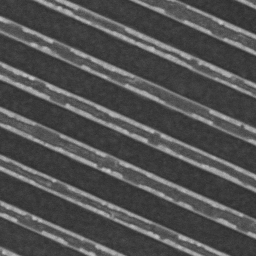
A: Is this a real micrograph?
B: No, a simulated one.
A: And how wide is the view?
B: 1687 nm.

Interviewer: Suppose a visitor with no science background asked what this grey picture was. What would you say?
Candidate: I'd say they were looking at parallel lines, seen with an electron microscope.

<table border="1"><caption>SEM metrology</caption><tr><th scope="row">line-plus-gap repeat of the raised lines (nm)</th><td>278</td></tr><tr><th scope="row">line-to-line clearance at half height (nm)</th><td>179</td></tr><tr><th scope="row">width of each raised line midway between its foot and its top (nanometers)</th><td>95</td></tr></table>